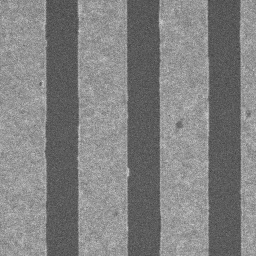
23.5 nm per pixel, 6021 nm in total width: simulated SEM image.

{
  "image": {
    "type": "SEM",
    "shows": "one or a few lines or trenches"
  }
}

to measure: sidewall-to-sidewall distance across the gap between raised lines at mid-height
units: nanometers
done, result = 794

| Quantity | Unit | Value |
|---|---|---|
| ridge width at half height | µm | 1.04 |